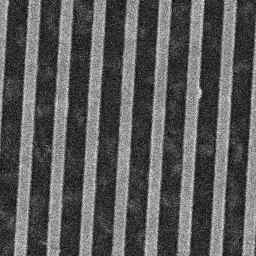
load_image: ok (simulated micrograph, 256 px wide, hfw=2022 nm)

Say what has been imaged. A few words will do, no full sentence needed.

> parallel lines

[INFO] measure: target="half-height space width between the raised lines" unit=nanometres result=171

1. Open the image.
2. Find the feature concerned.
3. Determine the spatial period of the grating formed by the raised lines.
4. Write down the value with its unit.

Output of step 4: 32.5 px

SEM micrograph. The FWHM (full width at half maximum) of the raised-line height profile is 85.8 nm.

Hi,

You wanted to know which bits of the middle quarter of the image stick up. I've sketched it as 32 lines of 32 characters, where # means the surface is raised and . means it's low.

#......##......##......###.....#
#......##......##......###.....#
#......##......##......##......#
#......##......##......##......#
#......##......##......##......#
#......##......##......##......#
#......##......##......##......#
#.....###......##......##......#
#.....###......##......##......#
#.....###.....###......##......#
#.....###.....###......##......#
#.....###.....###.....###......#
#.....###.....###.....###......#
......###.....###.....###.....##
......###.....###.....###.....##
......##......###.....###.....##
......##......###.....###.....##
......##......###.....###.....##
......##......##......###.....##
......##......##......###.....##
......##......##......##......##
......##......##......##......##
......##......##......##......##
.....###......##......##......##
.....###......##......##......##
.....###......##......##....#.##
.....###.....###......##......##
.....###.....###......##......##
.....###.....###.....###......##
.....###.....###.....###......##
.....###.....###.....###......##
.....###.....###.....###.....###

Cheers